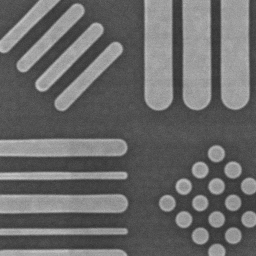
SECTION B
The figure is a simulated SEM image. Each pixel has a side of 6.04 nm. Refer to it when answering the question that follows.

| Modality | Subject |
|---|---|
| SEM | groups of lines, slits or small figures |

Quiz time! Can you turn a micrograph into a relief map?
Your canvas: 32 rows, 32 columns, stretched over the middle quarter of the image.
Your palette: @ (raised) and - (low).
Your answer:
@-----@@@@@---------@@@@@@@---@@
@----@@@@@----------@@@@@@@---@@
----@@@@@-----------@@@@@@@---@@
---@@@@@------------@@@@@@@---@@
--@@@@@-------------@@@@@@@---@@
-@@@@@--------------@@@@@@@---@@
@@@@@---------------@@@@@@@---@@
@@@@----------------@@@@@@@---@@
@@@-----------------@@@@@@@---@@
@@-------------------@@@@@@---@@
@--------------------@@@@@-----@
--------------------------------
--------------------------------
--------------------------------
--------------------------------
--------------------------------
--------------------------------
--------------------------------
--------------------------------
@@@@@@@@@@@@@@@-----------------
@@@@@@@@@@@@@@@@----------------
@@@@@@@@@@@@@@@@----------------
@@@@@@@@@@@@@@@-----------------
--------------------------------
--------------------------------
--------------------------------
--------------------------------
@@@@@@@@@@@@@@@-----------------
@@@@@@@@@@@@@@@-----------------
-----------------------------@@-
----------------------------@@@@
----------------------------@@@@